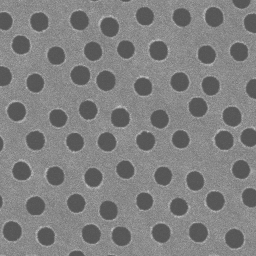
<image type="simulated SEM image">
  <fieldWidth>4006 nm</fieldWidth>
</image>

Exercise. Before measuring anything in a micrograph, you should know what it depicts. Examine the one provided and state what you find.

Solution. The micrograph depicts a regular array of holes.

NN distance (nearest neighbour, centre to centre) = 487 nm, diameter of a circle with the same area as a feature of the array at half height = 0.299 µm